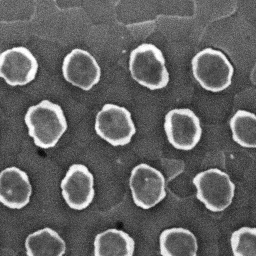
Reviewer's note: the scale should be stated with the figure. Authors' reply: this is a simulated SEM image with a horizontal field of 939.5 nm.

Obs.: a regular array of raised bodies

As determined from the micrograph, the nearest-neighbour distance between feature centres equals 241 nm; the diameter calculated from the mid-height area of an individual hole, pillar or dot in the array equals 0.139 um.